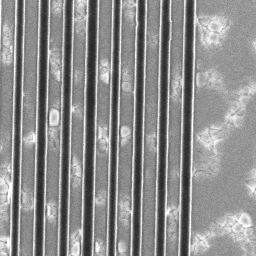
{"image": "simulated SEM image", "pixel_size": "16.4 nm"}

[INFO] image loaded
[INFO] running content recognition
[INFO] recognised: parallel lines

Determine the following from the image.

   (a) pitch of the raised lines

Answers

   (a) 0.397 um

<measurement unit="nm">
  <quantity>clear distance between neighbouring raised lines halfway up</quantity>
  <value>227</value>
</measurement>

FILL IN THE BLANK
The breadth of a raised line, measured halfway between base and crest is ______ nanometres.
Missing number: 170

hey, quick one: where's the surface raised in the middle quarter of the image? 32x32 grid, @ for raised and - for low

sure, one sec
@@----@@----@@----@@----@@----@@
@@----@@----@@----@@----@@----@@
@@----@@----@@----@@----@@----@@
@@---@@@--@-@@----@@----@@----@@
@@---@@@----@@----@@----@@----@@
@@---@@@----@@-@--@@----@@----@@
@@---@@@----@@----@@----@@----@@
@@---@@@----@@----@@----@@----@@
@@---@@@----@@----@@----@@----@@
@@---@@@----@@----@@----@@----@@
@@---@@@----@@----@@----@@----@@
@@---@@@----@@----@@----@@----@@
@@---@@@----@@----@@----@@---@@@
@@---@@@----@@----@@----@@----@@
@@---@@@---@@@----@@----@@---@@@
@@---@@@---@@@----@@----@@----@@
@@---@@@---@@@@@--@@----@@----@@
@@---@@@---@@@@@-@@@----@@---@@@
@@---@@@---@@@---@@@----@@---@@@
@@---@@@---@@@---@@@---@@@---@@@
@@---@@@---@@@---@@@---@@@---@@@
@@---@@@----@----@@@---@@@---@@@
@@---@@@---@@----@@@---@@@---@@@
@@---@@@----@----@@@---@@@---@@@
@@---@@@---@@----@@@---@@@---@@@
@----@@@---@@----@@@---@@@---@@@
@----@@@---@@----@@@---@@@---@@@
@----@@@---@@----@@@---@@@---@@@
@----@@@---@@----@@@---@@@---@@@
@----@@@---@@----@@@---@@@---@@@
@----@@@---@@----@@@---@@@---@@@
@----@@@---@@----@@@---@@@---@@@